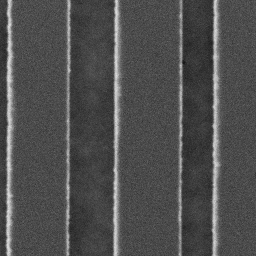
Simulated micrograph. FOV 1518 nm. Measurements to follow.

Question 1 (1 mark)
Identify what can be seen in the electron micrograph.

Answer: lines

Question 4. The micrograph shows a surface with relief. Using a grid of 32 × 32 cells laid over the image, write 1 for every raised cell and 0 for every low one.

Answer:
01111111100000011111111000011111
01111111100000011111111000011111
01111111100000011111111000011111
01111111100000011111111000011111
01111111100000011111111000011111
01111111100000011111111000011111
01111111100000011111111000011111
01111111100000011111111000011111
01111111100000011111111000011111
01111111100000011111111000011111
01111111100000111111111000011111
01111111100000111111111000011111
01111111100000111111111000011111
01111111100000111111111000011111
01111111100000111111111000011111
01111111100000111111111000011111
01111111100000111111111000011111
01111111100000111111111000011111
01111111100000111111111000011111
01111111100000111111111000011111
01111111100000111111111000011111
01111111100000111111111000011111
01111111100000111111111000011111
01111111100000111111111000011111
01111111100000111111111000011111
01111111100000111111111000011111
01111111100000111111111000011111
01111111100000111111111000011111
01111111000000111111111000011111
01111111100000111111111000011111
01111111100000111111111000011111
01111111100000111111111000011111